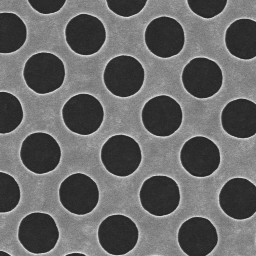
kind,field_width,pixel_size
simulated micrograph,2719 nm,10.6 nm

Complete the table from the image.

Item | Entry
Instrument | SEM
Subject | a regular array of holes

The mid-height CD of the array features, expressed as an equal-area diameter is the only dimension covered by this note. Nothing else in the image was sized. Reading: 41.1 pixels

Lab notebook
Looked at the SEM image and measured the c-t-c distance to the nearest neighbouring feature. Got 593 nm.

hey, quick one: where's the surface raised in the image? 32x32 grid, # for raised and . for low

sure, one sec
####....#####.....######....####
#####..#######...#######....####
...######...#######...########.#
...#####.....#####.....#####....
...#####.....#####.....#####....
...#####.....#####.....#####....
..#######...#######...#######...
###.....######...#######..######
###.....#####.....#####....#####
###.....#####.....#####.....####
###.....#####.....#####.....####
.###..########...#######...#####
..#######...#######...#######..#
...#####.....#####.....#####....
...#####.....#####.....#####....
..######.....#####.....#####....
.########...#######...######....
###....######....#######..######
###....######.....#####....#####
###.....#####.....#####.....####
###....######....######....#####
####..########...#######...#####
..######....######....#######..#
..#####.....######....######....
...####.....#####.....#####.....
..######....######....#####.....
.########..########...######....
###....######...#######...######
##.....#####.....#####.....#####
##.....#####.....#####.....#####
###....######....#####.....#####
.###..#######...#######...######